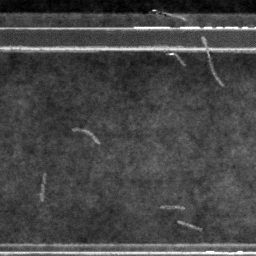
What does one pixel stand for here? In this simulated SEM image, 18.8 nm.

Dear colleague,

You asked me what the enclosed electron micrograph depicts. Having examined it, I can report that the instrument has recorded lines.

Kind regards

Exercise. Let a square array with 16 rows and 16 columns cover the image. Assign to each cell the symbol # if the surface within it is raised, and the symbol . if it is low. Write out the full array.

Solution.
................
################
################
................
................
................
................
................
................
................
................
................
................
................
................
################